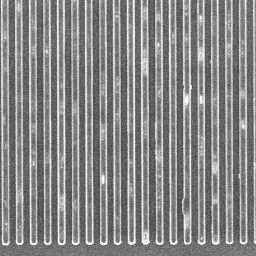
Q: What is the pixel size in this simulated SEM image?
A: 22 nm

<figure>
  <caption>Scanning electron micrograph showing parallel lines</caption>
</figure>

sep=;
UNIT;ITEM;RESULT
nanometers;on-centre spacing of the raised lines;307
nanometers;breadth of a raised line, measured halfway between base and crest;140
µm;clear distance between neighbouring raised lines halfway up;0.159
